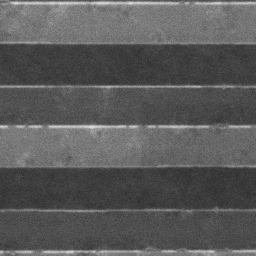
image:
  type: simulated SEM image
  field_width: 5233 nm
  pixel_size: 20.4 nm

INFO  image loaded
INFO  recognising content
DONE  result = lines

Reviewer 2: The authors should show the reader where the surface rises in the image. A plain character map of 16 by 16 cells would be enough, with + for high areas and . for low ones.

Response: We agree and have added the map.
++++++++++++++++
++++++++++++++++
++++++++++++++++
++++++++++++++++
++++++++++++++++
................
................
................
++++++++++++++++
++++++++++++++++
++++++++++++++++
++++++++++++++++
++++++++++++++++
................
................
.........+......